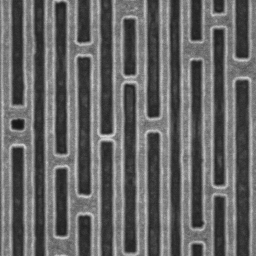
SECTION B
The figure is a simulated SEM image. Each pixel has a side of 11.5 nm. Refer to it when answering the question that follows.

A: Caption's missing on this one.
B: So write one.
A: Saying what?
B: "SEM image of parallel lines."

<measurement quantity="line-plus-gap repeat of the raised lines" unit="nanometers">258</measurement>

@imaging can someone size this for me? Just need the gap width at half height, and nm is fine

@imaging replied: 151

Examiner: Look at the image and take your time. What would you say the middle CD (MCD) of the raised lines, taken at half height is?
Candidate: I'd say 111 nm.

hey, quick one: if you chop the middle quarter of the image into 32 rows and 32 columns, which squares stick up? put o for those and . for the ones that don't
.oo....oo...ooo...oo....oo...oo.
.oo....oo...ooo...oo....oo...oo.
.oo....oo...ooo...oo....oo...ooo
.oo....oo...oooooooo....oo...oo.
.oo....oo...oooooooo....oo...oo.
.oo....oo....oo...oo....oo...ooo
.oo....oo....oo...oo....oo...ooo
.oo....oo....oo...oo....oo...ooo
.oo....oo....oo...oo....oo...ooo
.oo....oo....oo...oo....oo...ooo
.oo....oo....oo...oo....oo...ooo
.oo....oo....oo...oo....oo...ooo
.oo....oo....oo...oo....oo...ooo
.oo....oo....oo...ooo..ooo...ooo
.oo....oo....oo...oooooooo...ooo
.oo....oo....oo...oooooooo...ooo
.oo....oo....oo...oooooooo...ooo
.oo....oo...ooo...ooo...oo...ooo
.oo....oooooooo...oo....oo...ooo
.oo....oo...ooo...oo....oo...oo.
.oo....oo...ooo...oo....oo...ooo
.oo....oo...ooo...oo....oo...ooo
.oo....oo...ooo...ooo...oo...oo.
ooo....oo...ooo...ooo...oo...oo.
ooo....oo...ooo...ooo...oo...oo.
ooo....oo...ooo...ooo...oo...ooo
.oo....oo...ooo...ooo...oo...ooo
.oo....oo...ooo...ooo...oo....oo
.oo....oo...ooo...ooo...oo....oo
.oo....oo...ooo...ooo...oo....oo
.oo....oo...ooo...ooo...oo....oo
.oo....oo...ooo...ooo...oo....oo